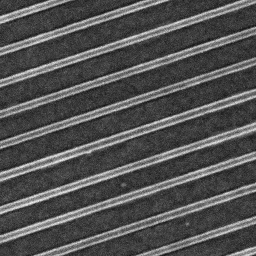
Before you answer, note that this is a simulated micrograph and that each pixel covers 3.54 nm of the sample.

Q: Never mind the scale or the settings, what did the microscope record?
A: parallel lines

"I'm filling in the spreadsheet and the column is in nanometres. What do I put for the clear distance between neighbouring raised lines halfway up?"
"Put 83.3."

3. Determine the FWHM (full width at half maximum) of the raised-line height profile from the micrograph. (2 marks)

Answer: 24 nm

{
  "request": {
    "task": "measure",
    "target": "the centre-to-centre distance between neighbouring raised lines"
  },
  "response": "0.106 micrometres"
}